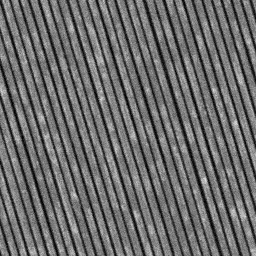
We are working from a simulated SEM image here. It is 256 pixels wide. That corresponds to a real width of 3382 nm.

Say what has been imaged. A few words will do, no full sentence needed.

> parallel lines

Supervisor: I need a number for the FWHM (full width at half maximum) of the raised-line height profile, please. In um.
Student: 0.0775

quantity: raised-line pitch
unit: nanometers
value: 122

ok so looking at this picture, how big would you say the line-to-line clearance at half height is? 44.2 nanometers